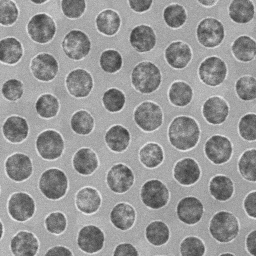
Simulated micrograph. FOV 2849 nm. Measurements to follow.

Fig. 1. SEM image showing a regular array of holes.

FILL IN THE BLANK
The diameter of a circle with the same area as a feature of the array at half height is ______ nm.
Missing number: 304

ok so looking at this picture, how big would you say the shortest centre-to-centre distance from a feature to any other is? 426 nanometres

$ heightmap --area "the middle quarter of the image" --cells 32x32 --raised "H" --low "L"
HHHHHHHHHLLLLLLHHHLLLLLHHHHLLLLH
HHLLLHHHHHLLLLHHHLLLLLLLHHHHHHHH
HLLLLLLHHHHHHHHHHLLLLLLLHHHHHHHH
HLLLLLLHHHHHHHHHHLLLLLLLHHHHHHHH
LLLLLLLHHHHHHHHHHLLLLLLLHHHHLLHH
LLLLLLLHHHHHHHHHHLLLLLLLHHHLLLLH
HLLLLLLHHHHLLLHHHHLLLLLHHHLLLLLL
HLLLLLHHHHLLLLLHHHHHLHHHHHLLLLLL
HHHHLHHHHHLLLLLHHHHHHHHHHHLLLLLL
HHHHHHHHHHLLLLLHHHHHLLHHHHLLLLLH
HHHHHHHHHHLLLLLHHHHLLLLLHHHHLLHH
HHHHHHHHHHHLLLHHHHLLLLLLHHHHHHHH
HHLLLLLHHHHHHHHHHLLLLLLLLHHHHHHH
HHLLLLLHHHHHHHHHHHLLLLLLLHHHLLLL
HHLLLLLLHHHHHHHHHHLLLLLLLHHLLLLL
HHLLLLLHHHHHLLLHHHHLLLLLHHLLLLLL
HHLLLLLHHHHLLLLLHHHHLLLHHHLLLLLL
HHHLLLHHHHLLLLLLHHHHHHHHHHLLLLLL
HHHHHHHHHHLLLLLLLHHHHHHHHHLLLLLL
HHHHHHHHHHLLLLLLHHHHHHHHHHLLLLLL
HHHHHHHHHHHLLLLLHHHHLLLLHHHLLLLL
HHHHLLLHHHHHLLLHHHHLLLLLLHHHHLLH
HHHLLLLLHHHHHHHHHHHLLLLLLHHHHHHH
HHLLLLLLHHHHHHHHHHHLLLLLLHHHHHLH
HHLLLLLLLHHHHHHHHHHLLLLLHHHHLLLL
HHLLLLLLLHHHLLLLHHHHLLLHHHHHLLLL
HHHLLLLLHHHLLLLLLHHHHHHHHHHLLLLL
HHHHLLLHHHHLLLLLLHHHHHHHHHHLLLLL
LHHHHHHHHHHLLLLLLLHHHHHHHHHHLLLL
LHHHHHHHHHHLLLLLLHHHLLLLHHHHLLLL
LHHHHHHHHHHLLLLLLHHHLLLLLHHHHHHH
LHHHLLLLHHHHLLLLHHHLLLLLLLHHHHHH